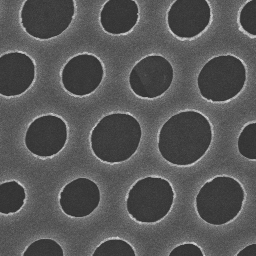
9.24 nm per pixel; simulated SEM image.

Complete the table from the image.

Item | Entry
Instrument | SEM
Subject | a regular array of holes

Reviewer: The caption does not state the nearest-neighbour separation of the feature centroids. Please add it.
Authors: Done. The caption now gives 643 nanometers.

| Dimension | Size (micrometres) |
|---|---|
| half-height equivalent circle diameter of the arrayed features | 0.422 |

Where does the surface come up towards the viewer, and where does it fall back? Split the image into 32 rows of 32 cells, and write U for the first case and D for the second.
UUUDDDDDDUUUUDDDDUUUUUDDDDUUUUUD
UUUDDDDDDUUUUDDDDUUUUDDDDDUUUUDD
UUUDDDDDDUUUUDDDDUUUUDDDDDUUUUDD
UUUDDDDDUUUUUDDDUUUUUDDDDDUUUUDD
UUUUDDDUUUUUUUUUUUUUUUDDUUUUUUUU
UUUUUUUUUUUUUUUUUUUUUUUUUUUUUUUU
UUUUUUUUUUUUUUUUUUUUUUUUUUUUUUUU
DDDDUUUUUDDDUUUUUUDDDUUUUUDDDDUU
DDDDUUUUDDDDDUUUUDDDDDUUUDDDDDDU
DDDDUUUUDDDDDUUUDDDDDDUUUDDDDDDU
DDDDUUUUDDDDUUUUDDDDDUUUUDDDDDUU
DDDUUUUUUDDUUUUUUDDDDUUUUDDDDDUU
UUUUUUUUUUUUUUUUUUUUUUUUUUDDUUUU
UUUUUUUUUUUUUUUUUUUUUUUUUUUUUUUU
UUUUUUDUUUUUUDDDUUUUUUDDDUUUUUUU
UUUUDDDDUUUUDDDDDUUUUDDDDDUUUUUD
UUUDDDDDUUUUDDDDDDUUDDDDDDUUUUDD
UUUDDDDDUUUDDDDDDUUUDDDDDDUUUUDD
UUUDDDDDUUUUDDDDDUUUDDDDDDUUUUDD
UUUUUDUUUUUUDDDDUUUUDDDDDUUUUUUD
UUUUUUUUUUUUUUUUUUUUUUDUUUUUUUUU
UUUUUUUUUUUUUUUUUUUUUUUUUUUUUUUU
UUUUUUUUUDDUUUUUUUDDDUUUUUUDDUUU
DDDUUUUUDDDDUUUUUDDDDUUUUDDDDDUU
DDDUUUUUDDDDUUUUDDDDDDUUUDDDDDUU
DDDUUUUUDDDDUUUUDDDDDUUUUDDDDDUU
DDUUUUUUDDDUUUUUDDDDDUUUUDDDDDUU
UUUUUUUUUUUUUUUUUDDDUUUUUUDDDUUU
UUUUUUUUUUUUUUUUUUUUUUUUUUUUUUUU
UUUUUUUUUUUUUUUUUUUUUUUUUUUUUUUU
UUUUDDDUUUUUUDDDUUUUUUUUUUUUUUUU
UUUDDDDDUUUUDDDDDUUUUDDDDUUUUUDD